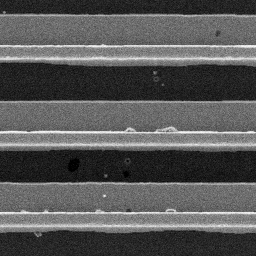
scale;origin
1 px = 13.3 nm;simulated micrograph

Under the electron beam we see lines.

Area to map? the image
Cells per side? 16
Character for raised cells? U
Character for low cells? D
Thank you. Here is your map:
DDDDDDDDDDDDDDDD
UUUUUUUUUUUUUUUU
UUUUUUUUUUUUUUUU
UUUUUUUUUUUUUUUU
DDDDDDDDDDDDDDDD
DDDDDDDDDDDDDDDD
UUUUUUUUUUUUUUUU
UUUUUUUUUUUUUUUU
UUUUUUUUUUUUUUUU
DDDDDDDDDDDDDDDD
DDDDDDDDDDDDDDDD
UUUUUUUUUUUUUUUU
UUUUUUUUUUUUUUUU
UUUUUUUUUUUUUUUU
DDDDDDDDDDDDDDDD
DDDDDDDDDDDDDDDD